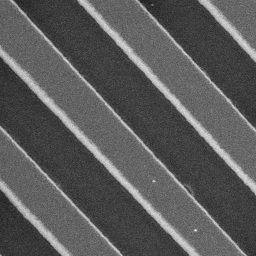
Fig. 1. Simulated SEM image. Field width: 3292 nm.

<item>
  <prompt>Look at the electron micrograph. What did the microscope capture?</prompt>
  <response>lines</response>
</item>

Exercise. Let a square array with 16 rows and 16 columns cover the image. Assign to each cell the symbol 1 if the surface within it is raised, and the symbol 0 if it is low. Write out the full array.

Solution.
1000011110000111
1100001111000011
1110000111100001
1111000011110000
0111100001111000
0011110000111100
0001111000011110
0000111100001110
1000011110000111
1100001110000011
1100000111000001
1110000011100001
0111000001110000
0011100000111000
0001110000011100
0001111000001110